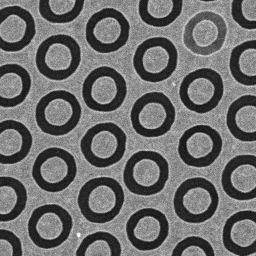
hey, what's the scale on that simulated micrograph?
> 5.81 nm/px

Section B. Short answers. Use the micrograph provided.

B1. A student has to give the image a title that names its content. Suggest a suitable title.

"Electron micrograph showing a regular array of ring-shaped grooves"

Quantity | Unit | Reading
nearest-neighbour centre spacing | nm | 318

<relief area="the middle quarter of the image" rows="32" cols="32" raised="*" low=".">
*...*************...******..****
...****......*****...****...****
..****........****.........****.
.****....***...****.......****..
*****...*****..*******.******...
*****..******...*************..*
****...******...*************..*
..***..******...****.....****..*
...**..******..****.......***..*
*...*...****...***.........***..
**..**........***...*****..***..
**..***......****...*****...***.
**..*************..******...****
**..*************..******...****
*...*************..******...****
...****.......***...****...*****
..****.........***........*****.
*****...****...***.......*****..
*****..******...*************..*
****...******...*************..*
****...******..**************..*
****...******..*************...*
..***...****...***......*****...
...**....*....**.........****...
...***.......***...***....****..
*..****....****...*****...*****.
*..************..*******..******
*..************..*******..******
...*****....***..*******..******
..****........*...*****...****..
.****....*....*.....*....****...
****...*****...*........****...*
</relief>